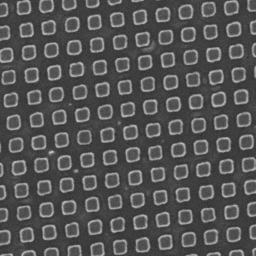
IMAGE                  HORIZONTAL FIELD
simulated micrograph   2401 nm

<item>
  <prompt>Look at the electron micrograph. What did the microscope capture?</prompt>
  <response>a regular array of raised bodies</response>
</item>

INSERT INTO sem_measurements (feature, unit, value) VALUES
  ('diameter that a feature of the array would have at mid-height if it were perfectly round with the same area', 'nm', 134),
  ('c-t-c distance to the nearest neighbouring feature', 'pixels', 22.4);